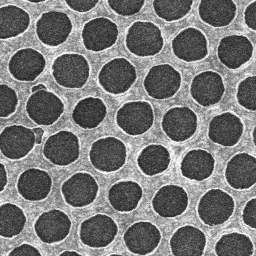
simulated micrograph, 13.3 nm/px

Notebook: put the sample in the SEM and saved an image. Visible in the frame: a regular array of holes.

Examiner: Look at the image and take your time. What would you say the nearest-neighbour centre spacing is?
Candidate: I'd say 0.598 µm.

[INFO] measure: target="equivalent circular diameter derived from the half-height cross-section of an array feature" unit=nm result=474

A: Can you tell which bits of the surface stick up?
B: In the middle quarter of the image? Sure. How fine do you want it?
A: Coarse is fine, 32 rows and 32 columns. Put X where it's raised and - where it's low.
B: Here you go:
------XXXX-------XXXXX-----XXXXX
-------XX---------XXX-------XXXX
------XXX---------XXX--------XXX
------XXX---------XX---------XXX
------XX----------XX---------XXX
-----XXXX--------XXX---------XXX
XXXXXXXXXX------XXXX---------XX-
XXXXXXXXXXXX--XXXXXXX-------XXXX
XXXXX----XXXXXXXXXXXXX----XXXXXX
XXX-------XXXXXX-----XXXXXXXXXXX
XXX--------XXXX-------XXXXXXXXXX
XX---------XX---------XXXX------
XX---------XX---------XXX-------
XX--------XXX----------XX-------
XXX-------XXX---------XX--------
XXXX-----XXXX---------XX--------
XXXXXXXXXXXXXXX------XXXX-------
---XXXXXXXXXXXXX----XXXXX-------
---XXXXXX----XXXXXXXXXXXXX------
----XXXX-------XXXXXXXXXXXXX-XXX
----XXX--------XXXXXX----XXXXXXX
----XXX---------XXXX------XXXXXX
----XX----------XXX-------XXXX--
----XX----------XX---------XXX--
--XXXXX--------XXX---------XX---
XXXXXXX--------XXX--------XXX---
XXXXXXXXX-----XXXXX------XXXX---
XX-----XXXXXXXXXXXXX---XXXXXX---
X------XXXXXXXXXXXXXXXXXXXXXXXX-
--------XXXXXX----XXXXXXXXXXXXXX
---------XXX-------XXXXXX----XXX
---------XX---------XXXX------XX